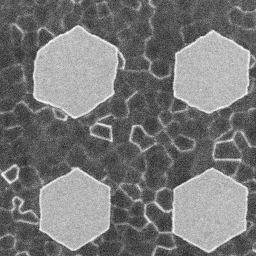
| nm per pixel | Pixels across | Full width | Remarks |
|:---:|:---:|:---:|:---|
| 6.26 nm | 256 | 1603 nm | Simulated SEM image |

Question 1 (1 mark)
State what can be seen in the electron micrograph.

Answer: raised bodies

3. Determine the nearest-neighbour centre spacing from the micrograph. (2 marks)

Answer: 848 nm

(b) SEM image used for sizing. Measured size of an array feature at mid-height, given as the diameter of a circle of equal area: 483 nm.